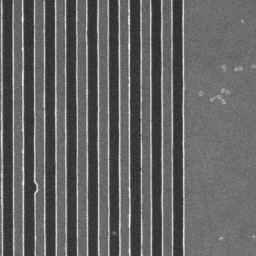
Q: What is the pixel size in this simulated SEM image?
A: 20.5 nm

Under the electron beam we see parallel lines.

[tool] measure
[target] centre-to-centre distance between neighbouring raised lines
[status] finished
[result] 436 nanometres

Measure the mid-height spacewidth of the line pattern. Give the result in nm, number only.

200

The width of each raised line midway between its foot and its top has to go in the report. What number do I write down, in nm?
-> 236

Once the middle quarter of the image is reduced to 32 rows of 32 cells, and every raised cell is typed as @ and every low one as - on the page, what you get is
@@@---@@@--@@@--@@@---@@@--@@@--
@@@---@@---@@@--@@@---@@@--@@@--
@@@---@@---@@@--@@@---@@@--@@@--
@@@---@@---@@@--@@@---@@---@@@--
@@@---@@---@@@--@@@---@@---@@@--
@@@---@@---@@@--@@@---@@---@@@--
@@@---@@---@@@--@@@---@@---@@@--
@@@---@@@--@@@--@@@---@@---@@@--
@@@---@@@--@@@--@@@---@@---@@@--
@@@---@@---@@@--@@@---@@---@@@--
@@@---@@@--@@@--@@@---@@@--@@@--
@@@---@@@--@@@--@@@---@@@--@@@--
@@@---@@---@@@--@@@---@@---@@@--
@@@---@@---@@@--@@@---@@@--@@@--
@@@---@@---@@@--@@@---@@---@@@--
@@@---@@---@@@--@@@---@@---@@@--
@@@---@@---@@@--@@@---@@@--@@@--
@@@---@@---@@@--@@@---@@@--@@@--
@@@---@@---@@@--@@@---@@@--@@@--
@@@---@@---@@@--@@@---@@@--@@@--
@@@---@@---@@@--@@@---@@---@@@--
@@@---@@---@@@--@@@---@@---@@@--
@@@---@@---@@@--@@@---@@---@@@--
@@@---@@---@@@--@@@---@@---@@@--
@@@---@@@--@@@--@@@---@@---@@@--
@@@---@@@--@@@--@@@---@@---@@@--
@@@---@@@--@@@--@@@---@@---@@@--
@@@---@@@--@@@--@@@---@@---@@@--
@@@---@@@--@@@--@@@---@@@--@@@--
-@@---@@@--@@@--@@@---@@@--@@@--
-@@---@@@--@@@--@@@---@@---@@@--
-@@---@@@--@@@--@@@---@@---@@@--